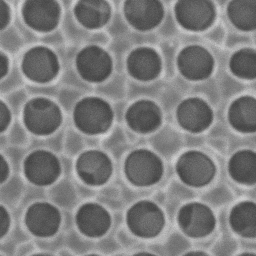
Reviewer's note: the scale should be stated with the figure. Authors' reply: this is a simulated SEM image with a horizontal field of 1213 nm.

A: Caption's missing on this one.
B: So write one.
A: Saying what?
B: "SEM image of a regular array of holes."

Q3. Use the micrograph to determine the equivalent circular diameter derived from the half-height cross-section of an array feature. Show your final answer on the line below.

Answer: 37.6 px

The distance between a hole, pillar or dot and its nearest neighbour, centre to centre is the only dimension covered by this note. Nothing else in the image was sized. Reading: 241 nm